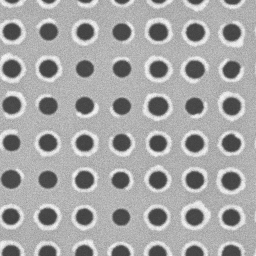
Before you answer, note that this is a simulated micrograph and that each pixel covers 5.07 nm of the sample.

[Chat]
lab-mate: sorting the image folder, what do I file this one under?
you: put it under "a regular array of holes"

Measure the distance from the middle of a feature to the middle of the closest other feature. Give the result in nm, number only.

184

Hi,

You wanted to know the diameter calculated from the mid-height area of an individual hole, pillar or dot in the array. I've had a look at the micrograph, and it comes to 0.0908 micrometres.